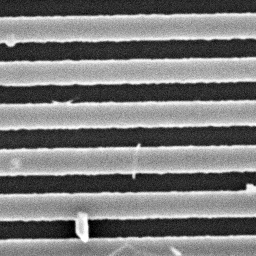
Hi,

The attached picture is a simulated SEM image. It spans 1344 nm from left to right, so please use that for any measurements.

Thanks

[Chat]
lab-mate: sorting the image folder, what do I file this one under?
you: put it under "lines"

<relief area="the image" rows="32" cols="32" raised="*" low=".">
................................
................................
********************************
********************************
********************************
.*..............................
................................
................****************
********************************
********************************
******.**.**....................
................................
................................
********************************
********************************
********************************
................................
................................
............********************
********************************
********************************
************************.*.*....
................................
...............................*
********************************
********************************
********************************
*******.***.....................
..........*.....................
..........*..............*..****
********************************
********************************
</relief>